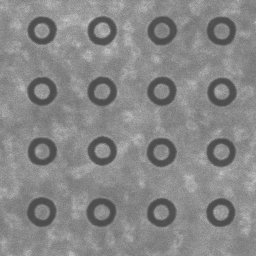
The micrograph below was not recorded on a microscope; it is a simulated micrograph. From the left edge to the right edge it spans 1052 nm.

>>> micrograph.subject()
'a regular array of ring-shaped grooves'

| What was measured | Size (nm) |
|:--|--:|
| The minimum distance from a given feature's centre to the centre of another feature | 244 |